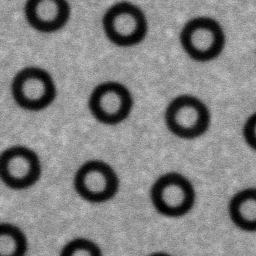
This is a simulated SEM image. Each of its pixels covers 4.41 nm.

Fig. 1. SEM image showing ring-shaped grooves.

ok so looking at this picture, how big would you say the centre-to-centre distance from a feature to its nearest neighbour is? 0.344 um